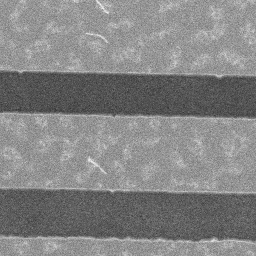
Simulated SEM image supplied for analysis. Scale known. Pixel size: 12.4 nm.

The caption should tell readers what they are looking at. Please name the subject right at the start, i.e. one or a few lines or trenches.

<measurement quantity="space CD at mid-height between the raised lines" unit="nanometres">556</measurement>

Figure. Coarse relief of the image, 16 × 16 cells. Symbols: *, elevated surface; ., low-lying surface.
****************
****************
****************
****************
.....***********
................
................
****************
****************
****************
****************
****************
................
................
................
****************